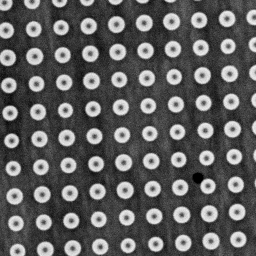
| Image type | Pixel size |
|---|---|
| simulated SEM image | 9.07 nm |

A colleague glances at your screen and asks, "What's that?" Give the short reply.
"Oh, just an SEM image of an array of small figures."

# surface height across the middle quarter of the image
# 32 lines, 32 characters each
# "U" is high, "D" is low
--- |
DDDDDDDDDDDDDDDDDDDDDDDDDDDDDDDD
DDDDDDDDDDDDDDDDDDDDDDDDDDDUDDDD
DDDDDDUUDDDDDUUDDDDUUUDDDDUUUDDD
UUDDDUUUUDDDUUUUDDDUUUUDDDUUUDDD
UUDDDUUUUDDDUUUUDDDUUUDDDDUUUDDD
UUDDDUUUDDDDDUUDDDDDDDDDDDDDDDDD
DDDDDDDDDDDDDDDDDDDDDDDDDDDDDDDD
DDDDDDDDDDDDDDDDDDDDDDDDDDDDDDDD
DDDDDDDDDDDDDDDDDDDDDDDDDDDUUDDD
DDDDDDDDDDDDDUUUDDDUUUUDDDUUUUDD
UUDDDDUUUDDDUUUUDDDUUUUDDDUUUUDD
UUDDDDUUUDDDUUUUDDDDUUUDDDDUUDDD
UUDDDDUUUDDDDUUDDDDDDDDDDDDDDDDD
DDDDDDDDDDDDDDDDDDDDDDDDDDDDDDDD
DDDDDDDDDDDDDDDDDDDDDDDDDDDDDDDD
DDDDDDDDDDDDDDDDDDDDDDDDDDDUUDDD
DDDDDDDUUDDDDUUUDDDDUUUDDDDUUUDD
UUDDDDUUUDDDDUUUDDDDUUUDDDDUUUDD
UUUDDDUUUDDDDUUUDDDDUUUDDDDUUDDD
UUDDDDUUUDDDDDUDDDDDDDDDDDDDDDDD
DDDDDDDDDDDDDDDDDDDDDDDDDDDDDDDD
DDDDDDDDDDDDDDDDDDDDDDDDDDDDDDDD
DDDDDDDDDDDDDDDDDDDDDUDDDDDDUUDD
DDDDDDDUUDDDDUUUUDDDUUUUDDDUUUDD
UUUDDDUUUUDDDUUUUDDDUUUUDDDUUUDD
UUUDDDUUUUDDDUUUUDDDUUUDDDDDUDDD
UUUDDDDUUDDDDDUUDDDDDDDDDDDDDDDD
DDDDDDDDDDDDDDDDDDDDDDDDDDDDDDDD
DDDDDDDDDDDDDDDDDDDDDDDDDDDDDDDD
DDDDDDDDDDDDDDDDDDDDDUUDDDDDUUDD
DUDDDDDUUUDDDDUUUDDDUUUUDDDUUUUD
UUUDDDDUUUDDDUUUUDDDUUUUDDDUUUUD